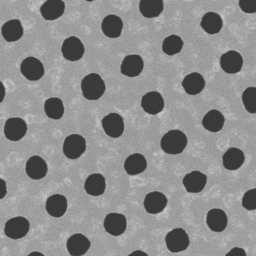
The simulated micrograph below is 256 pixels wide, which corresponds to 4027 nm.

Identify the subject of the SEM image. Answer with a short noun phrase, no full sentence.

a regular array of holes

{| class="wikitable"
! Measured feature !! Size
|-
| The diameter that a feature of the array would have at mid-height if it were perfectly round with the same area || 364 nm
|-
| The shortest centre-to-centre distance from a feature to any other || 43.2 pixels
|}